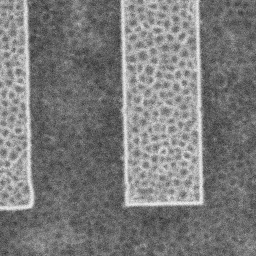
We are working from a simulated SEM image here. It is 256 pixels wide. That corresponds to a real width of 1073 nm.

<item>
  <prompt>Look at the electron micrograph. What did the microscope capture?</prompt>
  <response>one or a few lines or trenches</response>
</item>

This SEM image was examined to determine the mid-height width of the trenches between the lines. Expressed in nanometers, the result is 407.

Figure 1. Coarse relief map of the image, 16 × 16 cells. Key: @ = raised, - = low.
@@------@@@@----
@@------@@@@----
@@------@@@@----
@@------@@@@----
@@------@@@@----
@@------@@@@----
@@------@@@@----
@@------@@@@----
@@------@@@@----
@@------@@@@@---
@@------@@@@@---
@@------@@@@@---
@@------@@@@----
----------------
----------------
----------------